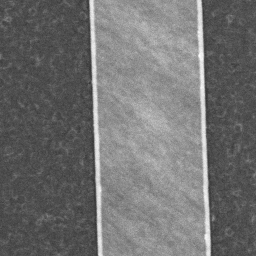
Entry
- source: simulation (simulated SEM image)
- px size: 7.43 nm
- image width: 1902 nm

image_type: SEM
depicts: one or a few lines or trenches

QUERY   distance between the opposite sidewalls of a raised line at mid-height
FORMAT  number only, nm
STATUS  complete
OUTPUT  804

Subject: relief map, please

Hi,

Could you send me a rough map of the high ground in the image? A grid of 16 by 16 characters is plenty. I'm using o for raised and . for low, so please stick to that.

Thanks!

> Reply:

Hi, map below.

......oooooo....
......ooooooo...
......ooooooo...
......ooooooo...
......ooooooo...
......ooooooo...
......ooooooo...
......ooooooo...
......ooooooo...
......ooooooo...
......ooooooo...
......ooooooo...
......ooooooo...
......ooooooo...
......ooooooo...
......ooooooo...